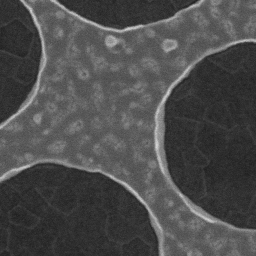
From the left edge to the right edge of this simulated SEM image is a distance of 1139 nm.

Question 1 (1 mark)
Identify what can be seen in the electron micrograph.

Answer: holes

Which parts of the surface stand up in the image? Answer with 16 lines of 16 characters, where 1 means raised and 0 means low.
0011000000001111
0011110001111111
0001111111111111
0001111111111000
0011111111110000
0011111111100000
0011111111000000
1111111111000000
1111111111000000
1111111111000000
1100011111000000
0000000011100000
0000000001110000
0000000001111000
0000000000111111
0000000000111111